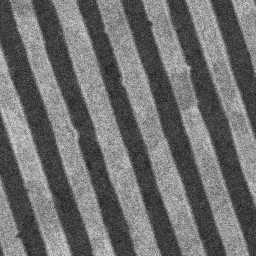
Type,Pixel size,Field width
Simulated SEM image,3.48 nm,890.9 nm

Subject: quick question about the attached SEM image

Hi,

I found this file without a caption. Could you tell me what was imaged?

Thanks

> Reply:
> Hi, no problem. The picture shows parallel lines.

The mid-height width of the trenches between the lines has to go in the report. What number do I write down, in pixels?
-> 23.9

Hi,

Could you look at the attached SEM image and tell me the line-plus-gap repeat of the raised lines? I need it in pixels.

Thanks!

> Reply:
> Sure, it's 42.2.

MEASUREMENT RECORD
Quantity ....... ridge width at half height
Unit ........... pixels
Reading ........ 17.6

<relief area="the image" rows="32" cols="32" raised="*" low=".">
.***...**...***...***...**...***
..**...***...**...***...***...**
..**....**...***...**...***...**
..***...***..***...***...**...**
...**...***...**...***...**....*
...**....**...***...**...***...*
...***...***..***...***...**...*
....**...***...**....**...**....
*...**...***...***...**...***...
*...***...***..***...***...**...
*....**...***...**....**...**...
**...**...***...***...**...***..
**....**...**...***...**....**..
***...**...***...**....**...**..
.**...**...***...***...**...***.
.**....**...**...***...**....**.
.***...**...***...**....**...**.
..**...***..***...***...**...***
..**...***...**...***...**....**
..***...**...***...**....**...**
...**...**...***...***...**...**
...**...***...***..***...**....*
...***...**...***...**...***...*
....**...**...***...***...**...*
*...**....**...**...***...**....
*...***...**...***...**...***...
*....**...**....**...***...**...
**...**....**...**...***...**...
**...***...**...***...**...***..
**....**...**...***...***...**..
***...**....**...**...***...**..
.**...***...**...***...**....**.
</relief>